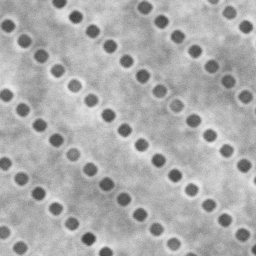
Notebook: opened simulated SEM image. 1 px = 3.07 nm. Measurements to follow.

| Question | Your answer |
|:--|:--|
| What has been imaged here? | a regular array of holes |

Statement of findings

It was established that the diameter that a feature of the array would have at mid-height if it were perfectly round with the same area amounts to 46.3 nanometres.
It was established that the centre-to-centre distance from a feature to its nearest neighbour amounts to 68 nanometres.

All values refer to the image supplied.